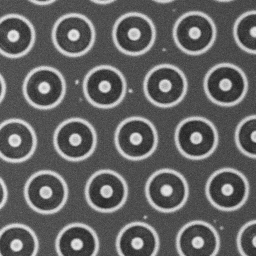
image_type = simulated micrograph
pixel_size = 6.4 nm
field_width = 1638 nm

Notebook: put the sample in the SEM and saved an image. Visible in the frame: an array of small figures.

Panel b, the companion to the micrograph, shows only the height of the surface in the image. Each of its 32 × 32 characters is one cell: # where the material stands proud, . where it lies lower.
################################
################################
...#####...####...#####...####..
....###....###.....###.....###..
....###.....##.....###.....###..
....###....####....###....####..
...#####..######..######.#######
################################
####################..#####..###
####...####....####....###....##
###.....###....###.....###.....#
###.....###....###.....###.....#
####...####....####...#####...##
################################
################################
#..#####...####....####...####..
....###.....###....###.....###..
....###.....###....###.....###..
....###.....###....####....###..
...#####...#####..######..######
################################
####################.#######.###
####....###....####....###....##
###.....###.....##.....###.....#
.##.....###.....###....###.....#
####....####...####....####...##
################################
################################
#..######..#####...####...#####.
....####....###....###.....###..
....###.....###.....##.....###..
....###.....###....####....###..